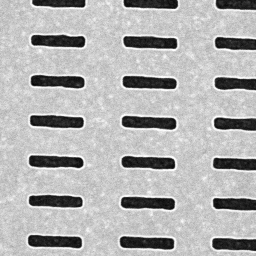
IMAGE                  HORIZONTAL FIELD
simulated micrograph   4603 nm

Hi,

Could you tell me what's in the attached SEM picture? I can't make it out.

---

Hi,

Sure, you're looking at a regular array of holes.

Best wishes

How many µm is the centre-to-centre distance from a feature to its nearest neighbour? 0.719